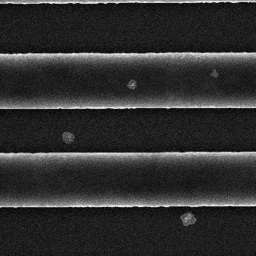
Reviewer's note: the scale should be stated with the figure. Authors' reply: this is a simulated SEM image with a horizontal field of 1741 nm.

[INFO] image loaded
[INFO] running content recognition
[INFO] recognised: lines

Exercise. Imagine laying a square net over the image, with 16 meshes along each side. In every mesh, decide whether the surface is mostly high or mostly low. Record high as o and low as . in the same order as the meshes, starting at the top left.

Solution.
................
................
................
oooooooooooooooo
oooooooooooooooo
oooooooooooooooo
oooooooooooooooo
................
................
................
oooooooooooooooo
oooooooooooooooo
oooooooooooooooo
................
................
................